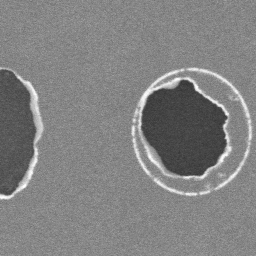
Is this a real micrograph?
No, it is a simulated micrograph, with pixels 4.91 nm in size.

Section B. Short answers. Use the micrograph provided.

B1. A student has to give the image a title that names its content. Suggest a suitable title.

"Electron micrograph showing holes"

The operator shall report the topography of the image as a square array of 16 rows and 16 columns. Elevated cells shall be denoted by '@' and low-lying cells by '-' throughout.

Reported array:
@@@@@@@@@@@@@@@@
@@@@@@@@@@@@@@@@
@@@@@@@@@@@@@@@@
@@@@@@@@@@@@@@@@
-@@@@@@@@@@@@@@@
--@@@@@@@@--@@@@
--@@@@@@@----@@@
--@@@@@@@-----@@
--@@@@@@@-----@@
--@@@@@@@-----@@
--@@@@@@@@---@@@
-@@@@@@@@@@@@@@@
@@@@@@@@@@@@@@@@
@@@@@@@@@@@@@@@@
@@@@@@@@@@@@@@@@
@@@@@@@@@@@@@@@@